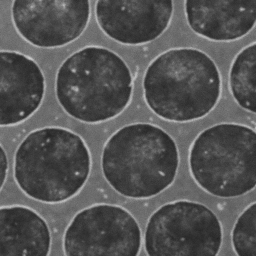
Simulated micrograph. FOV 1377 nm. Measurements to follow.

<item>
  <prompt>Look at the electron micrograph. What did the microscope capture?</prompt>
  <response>holes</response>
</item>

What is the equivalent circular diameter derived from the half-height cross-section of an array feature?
405 nm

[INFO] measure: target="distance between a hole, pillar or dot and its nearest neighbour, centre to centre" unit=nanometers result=471